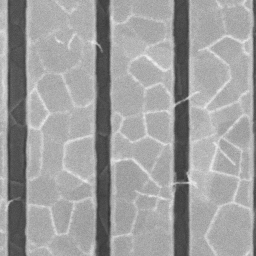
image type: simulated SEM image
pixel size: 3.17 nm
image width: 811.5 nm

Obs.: one or a few lines or trenches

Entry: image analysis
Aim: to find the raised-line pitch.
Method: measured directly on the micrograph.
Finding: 0.254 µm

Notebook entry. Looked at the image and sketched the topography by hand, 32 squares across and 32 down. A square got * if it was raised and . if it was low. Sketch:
*..*********..********..*******.
*..*********..********..*******.
*..*********..*******...********
*..*********..*******...********
*..*********..********..********
*..*********..********..********
*..*********..********..********
*..*********..********..********
*..*********..********..********
*..*********..********..********
*..*********..********..********
*..*********..********..********
*..*********..********..********
*..*********..********..********
*..*********..********..********
*..*********..********..********
*...********..********..********
*..*********..********..********
*..*********..********..********
*..*********..********..********
*..*********..********..********
*..*********..********..********
*..*********..********.*********
*..*********..********..********
*..*********..********..********
*..*********..********..********
*..*********..********..********
*..*********..********..********
*..*********..********..********
*..*********..********..*******.
*..*********..********..********
*..*********..********..********